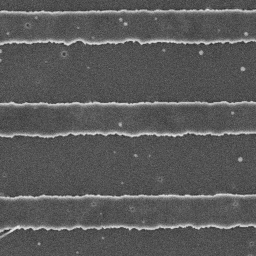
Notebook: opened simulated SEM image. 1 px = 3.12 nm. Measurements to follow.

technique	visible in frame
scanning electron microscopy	lines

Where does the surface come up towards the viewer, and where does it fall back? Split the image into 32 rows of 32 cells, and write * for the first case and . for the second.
................................
**...*....**********************
********************************
********************************
********************************
*.......*..**...................
................................
................................
................................
................................
................................
................................
................................
********************************
********************************
********************************
********************************
................................
................................
................................
................................
................................
................................
................................
.....*....***..*****************
********************************
********************************
********************************
**************..******..*..**...
................................
................................
................................